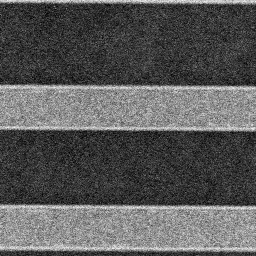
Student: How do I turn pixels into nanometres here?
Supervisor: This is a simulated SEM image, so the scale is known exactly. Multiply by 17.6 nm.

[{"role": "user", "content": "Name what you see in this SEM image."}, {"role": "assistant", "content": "one or a few lines or trenches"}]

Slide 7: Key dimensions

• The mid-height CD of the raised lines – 40 pixels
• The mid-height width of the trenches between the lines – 83.6 px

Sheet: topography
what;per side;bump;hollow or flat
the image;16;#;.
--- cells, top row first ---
................
................
................
................
................
##..............
################
################
................
................
................
................
................
################
################
................